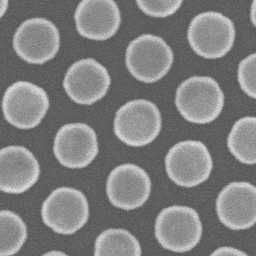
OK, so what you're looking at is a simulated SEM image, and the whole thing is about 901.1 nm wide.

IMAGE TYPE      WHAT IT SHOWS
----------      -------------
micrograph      a regular array of raised bodies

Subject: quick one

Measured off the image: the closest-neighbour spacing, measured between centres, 64.9 pixels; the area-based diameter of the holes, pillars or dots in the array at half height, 154 nm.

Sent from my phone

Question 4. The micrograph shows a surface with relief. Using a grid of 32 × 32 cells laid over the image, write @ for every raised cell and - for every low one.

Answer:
@---------@@@@---@@@@@----------
----------@@@@@---@@@-----------
----@-----@@@@@---------@@@@----
---@@@@---@@@@----------@@@@@---
--@@@@@----@@-----------@@@@@---
--@@@@@----------@@@@---@@@@@---
--@@@@@---------@@@@@----@@@----
---@@@----------@@@@@----------@
---------@@@@---@@@@@---------@@
--------@@@@@----@@@----------@@
--@-----@@@@@----------@@@@---@@
-@@@@----@@@@---------@@@@@@---@
-@@@@@---@@@----------@@@@@@----
-@@@@@---------@@@@---@@@@@-----
-@@@@----------@@@@@---@@@@-----
--@@-----------@@@@@----------@@
-------@@@@----@@@@@---------@@@
-------@@@@@---@@@@----------@@@
-@@----@@@@@----------@@@----@@@
@@@@---@@@@@---------@@@@@----@@
@@@@@---@@@----------@@@@@------
@@@@@---------@@@@---@@@@@------
@@@@----------@@@@----@@@-------
@@@-----------@@@@@---------@@@@
------@@@@----@@@@----------@@@@
------@@@@@---@@@@---------@@@@@
-----@@@@@@----------@@@---@@@@@
@@----@@@@@---------@@@@@---@@@@
@@@----@@@----------@@@@@----@--
@@@----------@@@----@@@@@-------
@@@---------@@@@@---@@@@--------
@@----------@@@@@----------@@@--